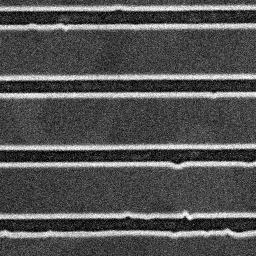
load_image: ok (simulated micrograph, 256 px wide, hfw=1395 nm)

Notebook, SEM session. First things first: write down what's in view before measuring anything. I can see one or a few lines or trenches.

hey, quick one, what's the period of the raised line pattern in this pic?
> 377 nm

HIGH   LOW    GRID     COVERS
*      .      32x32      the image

********************************
................................
................................
********************************
********************************
********************************
********************************
********************************
********************************
********************************
................................
................................
********************************
********************************
********************************
********************************
********************************
********************************
.......**.......................
................................
.................****..*******..
********************************
********************************
********************************
********************************
********************************
********************************
................................
................................
********************************
********************************
********************************